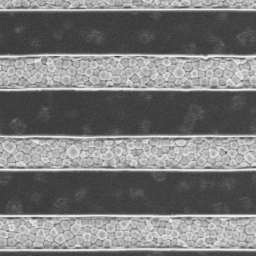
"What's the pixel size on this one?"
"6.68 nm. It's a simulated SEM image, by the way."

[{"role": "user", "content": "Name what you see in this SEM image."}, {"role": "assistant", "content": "one or a few lines or trenches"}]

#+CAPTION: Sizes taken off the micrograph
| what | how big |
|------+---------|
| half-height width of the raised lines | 319 nanometers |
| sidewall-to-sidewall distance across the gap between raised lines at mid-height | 0.214 µm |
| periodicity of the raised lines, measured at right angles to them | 534 nm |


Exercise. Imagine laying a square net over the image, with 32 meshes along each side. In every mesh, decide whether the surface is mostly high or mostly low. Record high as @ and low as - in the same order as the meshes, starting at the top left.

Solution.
--------------------------------
@@@@@@@@@@@@@@@@@@@@@@@@@@@@@@@@
@@@@@@@@@@@@@@@@@@@@@@@@@@@@@@@@
@@@@@@@@@@@@@@@@@@@@@@@@@@@@@@@@
@@@@@@@@@@@@@@@@@@@@@@@@@@@@@@@@
@@@@@@@@@@@@@@@@@@@@@@@@@@@@@@@@
@@@@@@@@@@@@@@@@@@@@@@@@@@@@@@@@
--------------------------------
--------------------------------
--------------------------------
--------------------------------
@@@@@@@@@@@@@@@@@@@@@@@@@@@@@@@@
@@@@@@@@@@@@@@@@@@@@@@@@@@@@@@@@
@@@@@@@@@@@@@@@@@@@@@@@@@@@@@@@@
@@@@@@@@@@@@@@@@@@@@@@@@@@@@@@@@
@@@@@@@@@@@@@@@@@@@@@@@@@@@@@@@@
@@@@@@@@@@@@@@@@@@@@@@@@@@@@@@@@
--------------------------------
--------------------------------
--------------------------------
--------------------------------
@@@@@@@@@@@@@@@@@@@@@@@@@@@@@@@@
@@@@@@@@@@@@@@@@@@@@@@@@@@@@@@@@
@@@@@@@@@@@@@@@@@@@@@@@@@@@@@@@@
@@@@@@@@@@@@@@@@@@@@@@@@@@@@@@@@
@@@@@@@@@@@@@@@@@@@@@@@@@@@@@@@@
@@@@@@@@@@@@@@@@@@@@@@@@@@@@@@@@
--------------------------------
--------------------------------
--------------------------------
--------------------------------
@@@@@@@@@@@@@@@@@@@@@@@@@@@@@@@@